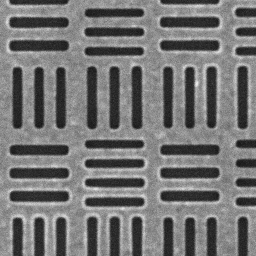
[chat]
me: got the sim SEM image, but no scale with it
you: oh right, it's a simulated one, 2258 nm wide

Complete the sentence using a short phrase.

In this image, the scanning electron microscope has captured groups of lines, slits or small figures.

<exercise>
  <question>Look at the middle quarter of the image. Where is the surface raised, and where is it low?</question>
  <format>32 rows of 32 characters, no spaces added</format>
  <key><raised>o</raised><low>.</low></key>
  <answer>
oooooo.ooooo.oooo..oooooo..oooo.
ooooo...ooo...ooo...ooooo...oo..
.oooo....oo...ooo...ooooo...oo..
.oooo....oo...ooo...ooooo...oo..
.oooo....oo...ooo...ooooo...oo..
.oooo...ooo...ooo...ooooo...oo..
.oooo...ooo...ooo...ooooo...oo..
.oooo...ooo...ooo...ooooo..ooo..
.oooo...ooo...ooo...ooooo..ooo..
.oooo...ooo...ooo...ooooo..ooo..
.oooo....oo...ooo...ooooo..ooo..
.oooo....oo...ooo...ooooo..ooo..
.oooo....oo...ooo...ooooo..ooo..
.oooo....oo...ooo...ooooo..ooo..
.oooo....oo...ooo...ooooo..ooo..
.ooooo..ooo...ooo...ooooo..ooo..
oooooooooooo.ooooo.ooooooooooooo
oooooooooooooooooooooooooooooooo
oooooooooooooooooooooooooooooooo
ooooo...............oooooooooooo
.oooo...............oooo........
.ooooooo...........ooooo........
.ooooooooooooooooooooooo........
ooooooooooo........ooooooooooooo
ooooo...............oooooooooooo
ooooo...............ooooo.......
.ooooooooooooooooooooooo........
..oooooooooooooooooooooo........
.ooooo..............oooo........
ooooo................ooooooooooo
ooooo...............oooooooooooo
.oooooooooooooooooooooooo.......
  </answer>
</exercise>